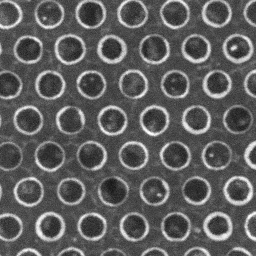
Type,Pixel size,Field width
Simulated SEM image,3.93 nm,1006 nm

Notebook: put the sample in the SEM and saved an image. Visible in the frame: a regular array of raised bodies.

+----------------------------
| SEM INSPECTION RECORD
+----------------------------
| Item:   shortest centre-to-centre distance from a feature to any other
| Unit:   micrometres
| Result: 0.161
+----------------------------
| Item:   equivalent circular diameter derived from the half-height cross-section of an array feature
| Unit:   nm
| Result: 113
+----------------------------